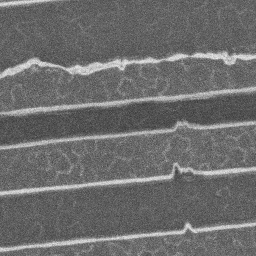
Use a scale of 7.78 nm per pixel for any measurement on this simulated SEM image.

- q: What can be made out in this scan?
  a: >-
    one or a few lines or trenches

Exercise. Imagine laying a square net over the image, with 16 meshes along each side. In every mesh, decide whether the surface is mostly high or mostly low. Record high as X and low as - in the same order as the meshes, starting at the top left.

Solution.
----------------
----------------
----------------
-----------XX---
XXXXXXXXXXXXXXXX
XXXXXXXXXXXXXXXX
XXXXXXX---------
----------------
-------XXXXXXXXX
XXXXXXXXXXXXXXXX
XXXXXXXXXXXXXXXX
XXXXXX----------
----------------
----------------
-----------XXXXX
-XXXXXXXXXXXXXXX